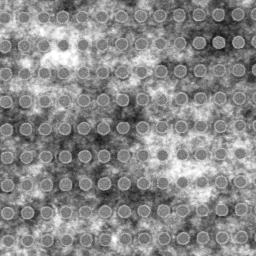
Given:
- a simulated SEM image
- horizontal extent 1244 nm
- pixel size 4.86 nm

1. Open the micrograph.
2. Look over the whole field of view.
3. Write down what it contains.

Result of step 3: a regular array of raised bodies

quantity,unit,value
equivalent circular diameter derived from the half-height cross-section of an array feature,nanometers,60.4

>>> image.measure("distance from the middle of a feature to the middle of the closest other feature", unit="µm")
0.0936